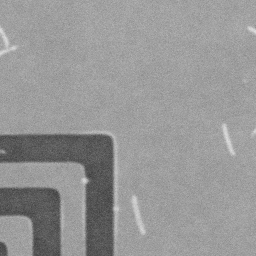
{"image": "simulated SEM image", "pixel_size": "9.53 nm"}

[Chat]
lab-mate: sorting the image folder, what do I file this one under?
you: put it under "groups of lines, slits or small figures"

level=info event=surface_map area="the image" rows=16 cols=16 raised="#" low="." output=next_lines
################
################
################
################
################
################
################
################
.......#########
.......#########
#####..#########
#####..#########
....#..#########
....#..#########
##..#..#########
##..#..#########